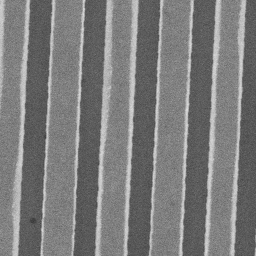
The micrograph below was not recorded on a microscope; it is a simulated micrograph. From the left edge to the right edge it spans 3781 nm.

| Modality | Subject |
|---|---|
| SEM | lines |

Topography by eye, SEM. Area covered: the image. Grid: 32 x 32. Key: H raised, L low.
HHHHLLLHHHLLLLHHHLLLHHHHLLLHHHHL
HHHHLLLHHHLLLLHHHLLLHHHHLLLHHHLL
HHHHLLLHHHLLLHHHHLLLHHHHLLLHHHLL
HHHLLLHHHHLLLHHHHLLLHHHHLLLHHHLL
HHHLLLHHHHLLLHHHHLLLHHHHLLLHHHLL
HHHLLLHHHHLLLHHHHLLLHHHHLLLHHHLL
HHHLLLHHHHLLLHHHHLLLHHHHLLLHHHLL
HHHLLLHHHHLLLHHHHLLLHHHHLLLHHHLL
HHHLLLHHHHLLLHHHHLLLHHHHLLLHHHLL
HHHLLLHHHHLLLHHHHLLLHHHHLLLHHHLL
HHHLLLHHHHLLLHHHHLLLHHHHLLLHHHLL
HHHLLLHHHHLLLHHHHLLLHHHHLLLHHHLL
HHHLLLHHHHLLLHHHHLLLHHHHLLLHHHLL
HHHLLLHHHHLLLHHHHLLLHHHLLLLHHHLL
HHHLLLHHHHLLLHHHHLLLHHHLLLLHHHLL
HHHLLLHHHHLLLHHHLLLLHHHLLLLHHHLL
HHHLLLHHHHLLLHHHLLLLHHHLLLLHHHLL
HHHLLLHHHHLLLHHHLLLHHHHLLLHHHHLL
HHHLLLHHHHLLLHHHLLLHHHHLLLHHHHLL
HHHLLLHHHHLLLHHHLLLHHHHLLLHHHHLL
HHHLLLHHHHLLLHHHLLLHHHHLLLHHHHLL
HHLLLLHHHHLLLHHHLLLHHHHLLLHHHHLL
HHLLLLHHHHLLLHHHLLLHHHHLLLHHHHLL
HHLLLLHHHLLLLHHHLLLHHHHLLLHHHLLL
HHLLLLHHHLLLHHHHLLLHHHHLLLHHHLLL
HHLLLHHHHLLLHHHHLLLHHHHLLLHHHLLL
HHLLLHHHHLLLHHHHLLLHHHHLLLHHHLLL
HHLLLHHHHLLLHHHHLLLHHHHLLLHHHLLL
HHLLLHHHHLLLHHHHLLLHHHHLLLHHHLLL
HHLLLHHHHLLLHHHHLLLHHHHLLLHHHLLL
HHLLLHHHHLLLHHHHLLLHHHHLLLHHHLLL
HHLLLHHHHLLLHHHHLLLHHHHLLLHHHLLL